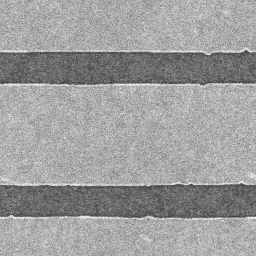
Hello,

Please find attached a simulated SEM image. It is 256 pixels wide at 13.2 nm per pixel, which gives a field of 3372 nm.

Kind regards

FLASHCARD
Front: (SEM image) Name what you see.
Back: one or a few lines or trenches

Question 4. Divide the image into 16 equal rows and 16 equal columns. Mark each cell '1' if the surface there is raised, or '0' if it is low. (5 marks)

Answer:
1111111111111111
1111111111111111
1111111111111111
0000000000000000
0000000000000000
1111111111111111
1111111111111111
1111111111111111
1111111111111111
1111111111111111
1111111111111111
1111111111101101
0000000000000000
0000000000000000
1111111111111111
1111111111111111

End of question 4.